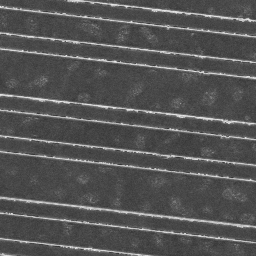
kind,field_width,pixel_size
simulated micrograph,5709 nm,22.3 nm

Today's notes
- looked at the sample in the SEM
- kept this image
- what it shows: parallel lines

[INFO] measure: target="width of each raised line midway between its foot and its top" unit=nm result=363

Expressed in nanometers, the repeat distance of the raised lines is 1160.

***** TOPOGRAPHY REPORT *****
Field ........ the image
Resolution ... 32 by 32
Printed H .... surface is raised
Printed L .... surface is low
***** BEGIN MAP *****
HHHHHHHHHHHHHHLLLLLLLLLLLLLLLLLL
LLLLLHHHHHHHHHHHHHHHHHLLLLLLLLLL
LLLLLLLLLLLLLLHHHHHHHHHHHHHHHHHH
LLLLLLLLLLLLLLLLLLLLLLHHHHHHHHHH
HHHHLLLLLLLLLLLLLLLLLLLLLLLLLLLH
HHHHHHHHHHHHLLLLLLLLLLLLLLLLLLLL
LLLHHHHHHHHHHHHHHHHHHLLLLLLLLLLL
LLLLLLLLLLLLHHHHHHHHHHHHHHHHHLLL
LLLLLLLLLLLLLLLLLLLLLHHHHHHHHHHH
LLLLLLLLLLLLLLLLLLLLLLLLLLLLLHHH
LLLLLLLLLLLLLLLLLLLLLLLLLLLLLLLL
LLLLLLLLLLLLLLLLLLLLLLLLLLLLLLLL
HHHHHHLLLLLLLLLLLLLLLLLLLLLLLLLL
HHHHHHHHHHHHHHHLLLLLLLLLLLLLLLLL
LLLLLLHHHHHHHHHHHHHHHHHHLLLLLLLL
LLLLLLLLLLLLLLLHHHHHHHHHHHHHHHHH
LLLLLLLLLLLLLLLLLLLLLLLHHHHHHHHH
HHHHHLLLLLLLLLLLLLLLLLLLLLLLLLLL
HHHHHHHHHHHHHLLLLLLLLLLLLLLLLLLL
LLLLHHHHHHHHHHHHHHHHHHLLLLLLLLLL
LLLLLLLLLLLLLHHHHHHHHHHHHHHHHHHL
LLLLLLLLLLLLLLLLLLLLLLHHHHHHHHHH
LLLLLLLLLLLLLLLLLLLLLLLLLLLLLLHH
LLLLLLLLLLLLLLLLLLLLLLLLLLLLLLLL
LLLLLLLLLLLLLLLLLLLLLLLLLLLLLLLL
HHHHHHHLLLLLLLLLLLLLLLLLLLLLLLLL
HHHHHHHHHHHHHHHLLLLLLLLLLLLLLLLL
LLLLLLLHHHHHHHHHHHHHHHHHLLLLLLLL
LLLLLLLLLLLLLLLLHHHHHHHHHHHHHHHH
LLLLLLLLLLLLLLLLLLLLLLLLLHHHHHHH
HHHHHHLLLLLLLLLLLLLLLLLLLLLLLLLL
HHHHHHHHHHHHHHHLLLLLLLLLLLLLLLLL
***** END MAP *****